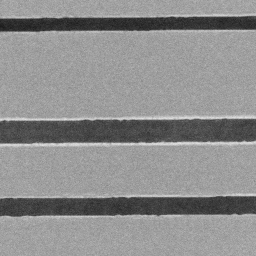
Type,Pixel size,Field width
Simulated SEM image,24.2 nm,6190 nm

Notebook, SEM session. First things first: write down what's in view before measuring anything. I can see lines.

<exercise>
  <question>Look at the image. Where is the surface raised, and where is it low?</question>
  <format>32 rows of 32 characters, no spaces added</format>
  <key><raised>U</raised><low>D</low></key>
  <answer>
UUUUUUUUUUUUUUUUUUUUUUUUUUUUUUUU
UUUUUUUUUUUUUUUUUUUUUUUUUUUUUUUU
DDDDDDDDDDDDDDDDDDDDDDDDDDDDDDDD
DDDDDDDDDDDDDDDDDDDDDDDDDDDDDDDD
UUUUUUUUUUUUUUUUUUUUUUUUUUUUUUUU
UUUUUUUUUUUUUUUUUUUUUUUUUUUUUUUU
UUUUUUUUUUUUUUUUUUUUUUUUUUUUUUUU
UUUUUUUUUUUUUUUUUUUUUUUUUUUUUUUU
UUUUUUUUUUUUUUUUUUUUUUUUUUUUUUUU
UUUUUUUUUUUUUUUUUUUUUUUUUUUUUUUU
UUUUUUUUUUUUUUUUUUUUUUUUUUUUUUUU
UUUUUUUUUUUUUUUUUUUUUUUUUUUUUUUU
UUUUUUUUUUUUUUUUUUUUUUUUUUUUUUUU
UUUUUUUUUUUUUUUUUUUUUUUUUUUUUUUU
UUUUUUUUUUUUUUUUUUUUUUUUUUUUUUUU
DDDDDDDDDDDDDDDDDDDDDDDDDDDDDDDD
DDDDDDDDDDDDDDDDDDDDDDDDDDDDDDDD
DDDDDDDDDDDDDDDDDDDDDDDDDDDDDDDD
UUUUUUUUUUUUUUUUUUUUUUUUUUUUUUUU
UUUUUUUUUUUUUUUUUUUUUUUUUUUUUUUU
UUUUUUUUUUUUUUUUUUUUUUUUUUUUUUUU
UUUUUUUUUUUUUUUUUUUUUUUUUUUUUUUU
UUUUUUUUUUUUUUUUUUUUUUUUUUUUUUUU
UUUUUUUUUUUUUUUUUUUUUUUUUUUUUUUU
UUUUUUUUUUUUUUUUUUUUUUUUUUUDDDDD
DDDDDDDDDDDDDDDDDDDDDDDDDDDDDDDD
DDDDDDDDDDDDDDDDDDDDDDDDDDDDDDDD
UUUUUUUUUUUUUUUUUUUUUUUUUUUUUUUU
UUUUUUUUUUUUUUUUUUUUUUUUUUUUUUUU
UUUUUUUUUUUUUUUUUUUUUUUUUUUUUUUU
UUUUUUUUUUUUUUUUUUUUUUUUUUUUUUUU
UUUUUUUUUUUUUUUUUUUUUUUUUUUUUUUU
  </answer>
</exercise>